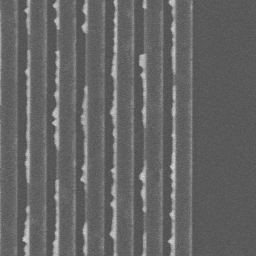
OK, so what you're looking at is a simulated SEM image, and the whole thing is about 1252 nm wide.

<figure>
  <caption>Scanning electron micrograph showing parallel lines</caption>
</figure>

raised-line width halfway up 97.9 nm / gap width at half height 45.3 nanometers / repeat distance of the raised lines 29.2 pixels